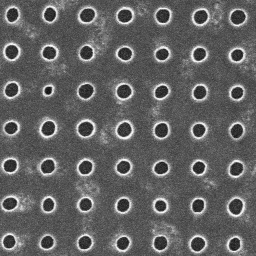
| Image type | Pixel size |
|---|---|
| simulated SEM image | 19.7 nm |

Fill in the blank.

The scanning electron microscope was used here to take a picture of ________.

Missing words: a regular array of holes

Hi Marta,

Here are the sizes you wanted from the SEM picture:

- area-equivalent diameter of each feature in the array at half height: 274 nanometers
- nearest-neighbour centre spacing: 736 nanometers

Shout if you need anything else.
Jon